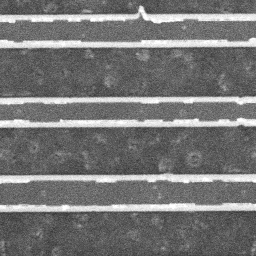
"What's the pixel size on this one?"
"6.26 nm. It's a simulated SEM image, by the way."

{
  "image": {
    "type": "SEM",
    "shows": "one or a few lines or trenches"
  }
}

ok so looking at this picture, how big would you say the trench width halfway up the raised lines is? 333 nanometers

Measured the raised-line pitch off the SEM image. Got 0.508 microns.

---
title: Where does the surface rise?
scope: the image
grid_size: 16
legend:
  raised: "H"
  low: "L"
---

LLLLLLLLLLLLLLLL
HHHHHHHHHHHHHHHH
HHHHHHHHHHHHHHHH
LLLLLLLLLLLLLLLL
LLLLLLLLLLLLLLLL
LLLLLLLLLLLLLLLL
HHHHHHHHHHHHHHHH
HHHHHHHHHHHHHHHH
LLLLLLLLLLLLLLLL
LLLLLLLLLLLLLLLL
LLLLLLLLLLLLLLLL
HHHHHHHHHHHHHHHH
HHHHHHHHHHHHHHHH
LLLLLLLLLLLLLLLL
LLLLLLLLLLLLLLLL
LLLLLLLLLLLLLLLL